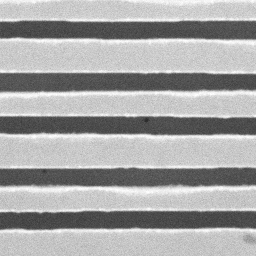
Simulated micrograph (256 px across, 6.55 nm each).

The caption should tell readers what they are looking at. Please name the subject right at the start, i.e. lines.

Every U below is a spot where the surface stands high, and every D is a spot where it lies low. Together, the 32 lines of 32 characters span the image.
UUUUUUUUUUUUUUUUUUUUUUUUUUUUUUUU
UUUUUUUUUUUUUUUUUUUUUUUUUUUUUUUU
UUUDDDDDUUUUUUUUUUUUUUUDDUDDDDDD
DDDDDDDDDDDDDDDDDDDDDDDDDDDDDDDD
DDDDDDDDDDDDDDDDDDDDDDDDDDDDDDDD
UUUUUUUUUUUUUUUUUUUUUUUUUUUUUUUU
UUUUUUUUUUUUUUUUUUUUUUUUUUUUUUUU
UUUUUUUUUUUUUUUUUUUUUUUUUUUUUUUU
UUUUUUUUUUUUUUUUUUUUUUUUUUUUUUUU
DDDDDDDDDDDDDDDDDDDDDDDDDDDDDDDD
DDDDDDDDDDDDDDDDDDDDDDDDDDDDDDDD
DDDDDDDDDDUUDUUUUUUUUUUUUUUUUUUU
UUUUUUUUUUUUUUUUUUUUUUUUUUUUUUUU
UUUUUUUUUUUUUUUUUUUUUUUUUUUUUUUU
DDDDDDDDDDDDDDDUUDDDDUUUUUUUUUUU
DDDDDDDDDDDDDDDDDDDDDDDDDDDDDDDD
DDDDDDDDDDDDDDDDDDDDDDDDDDDDDDDD
UUUUUUUUUUUUUUUUUUUUUUUUUUUUUUUU
UUUUUUUUUUUUUUUUUUUUUUUUUUUUUUUU
UUUUUUUUUUUUUUUUUUUUUUUUUUUUUUUU
UUUUUUUUUUUUUUUUUUUUUUUUUUUUUUUU
DDDDDDDDDDDDDDDDDDDDDDDDDDDDDDDD
DDDDDDDDDDDDDDDDDDDDDDDDDDDDDDDD
UUUUUUUUUUUUUUUUUUUUUUUUUUUUUUUU
UUUUUUUUUUUUUUUUUUUUUUUUUUUUUUUU
UUUUUUUUUUUUUUUUUUUUUUUUUUUUUUUU
DDUDUUUUDDDDDDDDDDDDDDDDDDDDDDDD
DDDDDDDDDDDDDDDDDDDDDDDDDDDDDDDD
DDDDDDDDDDDDDDDDDDDDDDDDDDDDDDDD
UUUUUUUUUUUUUUUUUUUUUUUUUUUUUUUU
UUUUUUUUUUUUUUUUUUUUUUUUUUUUUUUU
UUUUUUUUUUUUUUUUUUUUUUUUUUUUUUUU